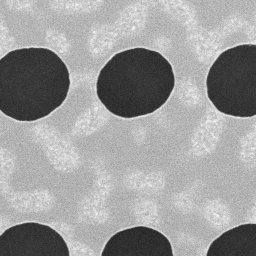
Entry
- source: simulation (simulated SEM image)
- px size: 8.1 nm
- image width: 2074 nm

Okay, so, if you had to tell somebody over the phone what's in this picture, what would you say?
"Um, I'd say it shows holes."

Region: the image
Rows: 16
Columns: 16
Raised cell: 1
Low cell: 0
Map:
1111111111111111
1111111111111111
1111111111111111
0000111000111100
0000110000011000
0000110000011000
0000110000111000
1011111111111111
1111111111111111
1111111111111111
1111111111111111
1111111111111111
1111111111111111
1111111111111111
0000111000111100
0000111000011000